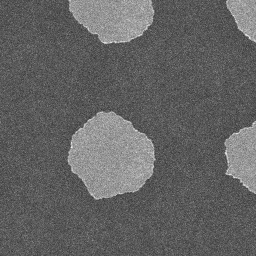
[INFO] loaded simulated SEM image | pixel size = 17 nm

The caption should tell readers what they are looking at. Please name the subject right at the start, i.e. raised bodies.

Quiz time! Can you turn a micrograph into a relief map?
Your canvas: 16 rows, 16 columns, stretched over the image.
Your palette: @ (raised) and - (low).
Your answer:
----@@@@@@----@@
-----@@@@------@
------@@--------
----------------
----------------
----------------
----------------
------@@--------
-----@@@@------@
----@@@@@@----@@
----@@@@@@----@@
-----@@@@------@
----------------
----------------
----------------
----------------